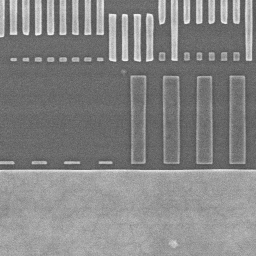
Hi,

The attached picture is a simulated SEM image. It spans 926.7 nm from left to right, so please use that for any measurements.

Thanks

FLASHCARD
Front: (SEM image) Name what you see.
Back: wiring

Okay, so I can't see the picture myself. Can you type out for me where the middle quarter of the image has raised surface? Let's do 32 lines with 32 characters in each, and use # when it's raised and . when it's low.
................................
................................
................................
.................###.....####...
.................###.....####...
.................###.....####...
.................###.....####...
.................###.....####...
.................###.....####...
.................###.....####...
.................###.....####...
.................###.....####...
.................###.....####...
.................###.....####...
.................###.....####...
.................###.....####...
.................###.....####...
.................###.....####...
.................###.....####...
.................###.....####...
.................###.....####...
.................###.....####...
.................###.....####...
.................###.....####...
.................###.....####...
................................
................................
################################
################################
################################
################################
################################